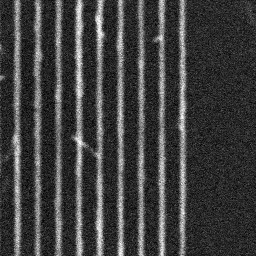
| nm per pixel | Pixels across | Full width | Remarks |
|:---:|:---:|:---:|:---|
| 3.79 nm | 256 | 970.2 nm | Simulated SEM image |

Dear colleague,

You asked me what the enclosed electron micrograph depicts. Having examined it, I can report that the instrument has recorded parallel lines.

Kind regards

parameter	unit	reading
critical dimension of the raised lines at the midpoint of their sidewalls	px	4.25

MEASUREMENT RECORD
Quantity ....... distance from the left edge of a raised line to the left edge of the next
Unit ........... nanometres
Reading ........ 78.3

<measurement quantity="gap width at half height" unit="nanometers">64.5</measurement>